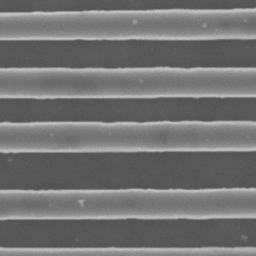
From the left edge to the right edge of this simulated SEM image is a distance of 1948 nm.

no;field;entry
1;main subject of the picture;lines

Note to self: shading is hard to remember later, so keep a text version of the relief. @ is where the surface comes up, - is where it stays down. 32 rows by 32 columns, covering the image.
--------------------------------
-----------@@@@@@@@@@@@@@@@@@@@@
@@@@@@@@@@@@@@@@@@@@@@@@@@@@@@@@
@@@@@@@@@@@@@@@@@@@@@@@@@@@@@@@@
@@@@@@@@@@@@@@@@@@@@@@@@@@@@@@@@
--------------------------------
--------------------------------
--------------------------------
--------------------------------
@@@@@@@@@@@@@@@@@@@@@@@@@@@@@@@@
@@@@@@@@@@@@@@@@@@@@@@@@@@@@@@@@
@@@@@@@@@@@@@@@@@@@@@@@@@@@@@@@@
--------------------------------
--------------------------------
--------------------------------
@@@@@@@@@@@@@@@@@@@@@@@@@@@@@@@@
@@@@@@@@@@@@@@@@@@@@@@@@@@@@@@@@
@@@@@@@@@@@@@@@@@@@@@@@@@@@@@@@@
@@@@@@@@@@@@@@@@@@@@@@@@@@@@@@@@
--------------------------------
--------------------------------
--------------------------------
--------------------------------
--------------------------------
@@@@@@@@@@@@@@@@@@@@@@@@@@@@@@@@
@@@@@@@@@@@@@@@@@@@@@@@@@@@@@@@@
@@@@@@@@@@@@@@@@@@@@@@@@@@@@@@@@
--------------------------------
--------------------------------
--------------------------------
--------------------------------
@@@@@@@@@@@@@@@@@@@@@@@@@@@@@@@@